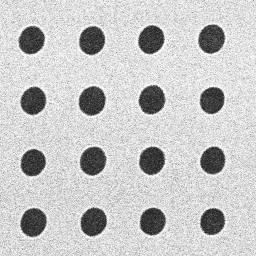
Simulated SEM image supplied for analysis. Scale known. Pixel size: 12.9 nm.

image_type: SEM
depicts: a regular array of holes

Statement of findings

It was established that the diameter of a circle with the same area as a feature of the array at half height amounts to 354 nm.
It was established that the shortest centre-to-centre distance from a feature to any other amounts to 767 nanometers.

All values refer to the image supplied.